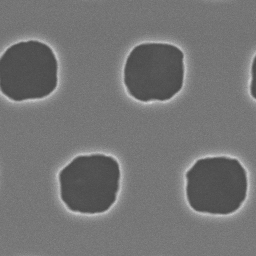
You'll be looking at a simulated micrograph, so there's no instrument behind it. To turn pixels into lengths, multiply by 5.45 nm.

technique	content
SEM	holes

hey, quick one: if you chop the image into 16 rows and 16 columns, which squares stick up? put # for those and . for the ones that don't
################
################
################
...#####...#####
....####...#####
...#####...#####
################
################
################
################
####...#####...#
####...#####...#
####...#####...#
################
################
################